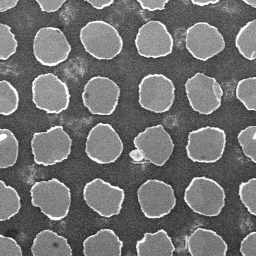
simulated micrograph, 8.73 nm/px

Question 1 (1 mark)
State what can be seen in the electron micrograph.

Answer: a regular array of raised bodies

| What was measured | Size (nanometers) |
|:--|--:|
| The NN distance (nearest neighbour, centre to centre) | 430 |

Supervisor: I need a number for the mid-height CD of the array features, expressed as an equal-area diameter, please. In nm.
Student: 325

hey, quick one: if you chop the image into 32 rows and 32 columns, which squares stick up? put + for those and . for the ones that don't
++...+++...++.....+++....+.....+
................................
................................
+.........++++....+++...+++...++
++...+++..+++++..++++..+++++..++
++..+++++.+++++..++++..+++++..++
++..+++++..++++..++++...+++...++
.....+++........................
................................
.....++.................++......
+...++++...+++....++++.++++...++
++..++++..+++++..+++++.+++++..++
++..++++..+++++..+++++..++++..++
++...+++...+++....+++...+++....+
................................
................................
+.....++...+++....+++...++++..++
++..+++++..++++..++++...++++..++
++..+++++..++++..+++++.+++++..++
++..++++...++++.+++++...++++...+
++...+.............+............
................................
......+.....+...........++.....+
+...++++...++++..++++...++++..++
++..+++++..++++..+++++.+++++..++
+++.+++++..++++...++++.+++++...+
++...+++....+++...+++....++....+
+...............................
................................
.....+++...+++....+++...+++....+
++..++++..+++++..+++++..++++..++
+++.+++++.+++++..+++++..++++..++